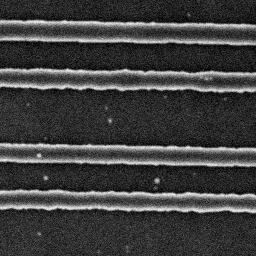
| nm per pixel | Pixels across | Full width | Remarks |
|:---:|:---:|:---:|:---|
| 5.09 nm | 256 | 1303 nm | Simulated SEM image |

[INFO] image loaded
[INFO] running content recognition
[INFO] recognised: lines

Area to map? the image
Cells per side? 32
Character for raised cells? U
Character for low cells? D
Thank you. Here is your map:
DDDDDDDDDDDDDDDDDDDDDDDDDDDDDDDD
DDDDDDDDDDDDDDDDDDDDDDDDDDDDDDDD
DDDDDDDDDDDDDDDDDDDDDDDDDDDDDDDD
UUUUUUUUUUUUUUUUUUUUUUUUUUUUUUUU
UUUUUUUUUUUUUUUUUUUUUUUUUUUUUUUU
DDDDDDDDDDDDDDDDDDDDDDDDDDDDUUUU
DDDDDDDDDDDDDDDDDDDDDDDDDDDDDDDD
DDDDDDDDDDDDDDDDDDDDDDDDDDDDDDDD
DDDDDDDDDDDDDDDDDDDDDDDDDDDDDDDD
UUUUUUUUUUUUUUUUUUUUUUUUUUUUUUUU
UUUUUUUUUUUUUUUUUUUUUUUUUUUUUUUU
DDDDDDDDDDDDDDDDDDDDDDDDDDDDDDDD
DDDDDDDDDDDDDDDDDDDDDDDDDDDDDDDD
DDDDDDDDDDDDDDDDDDDDDDDDDDDDDDDD
DDDDDDDDDDDDDDDDDDDDDDDDDDDDDDDD
DDDDDDDDDDDDDDDDDDDDDDDDDDDDDDDD
DDDDDDDDDDDDDDDDDDDDDDDDDDDDDDDD
DDDDDDDDDDDDDDDDDDDDDDDDDDDDDDDD
UUUUUUUUUUUUUUUUUUUUUUUUUUDUUDDD
UUUUUUUUUUUUUUUUUUUUUUUUUUUUUUUU
DDDDDDDDDDDDDDDDDDDUUUUUUUUUUUUU
DDDDDDDDDDDDDDDDDDDDDDDDDDDDDDDD
DDDDDDDDDDDDDDDDDDDDDDDDDDDDDDDD
DDDDDDDDDDDDDDDDDDDDDDDDDDDDDDDD
UUUUUUUUUUUUUUUUUUUUUUUUUUUUUUUU
UUUUUUUUUUUUUUUUUUUUUUUUUUUUUUUU
DDDDDDDDDDDDDDDDDDDDDDDDDDDDDDDU
DDDDDDDDDDDDDDDDDDDDDDDDDDDDDDDD
DDDDDDDDDDDDDDDDDDDDDDDDDDDDDDDD
DDDDDDDDDDDDDDDDDDDDDDDDDDDDDDDD
DDDDDDDDDDDDDDDDDDDDDDDDDDDDDDDD
DDDDDDDDDDDDDDDDDDDDDDDDDDDDDDDD